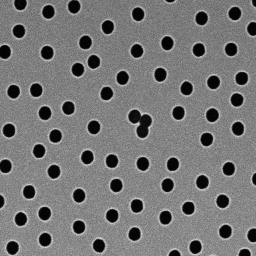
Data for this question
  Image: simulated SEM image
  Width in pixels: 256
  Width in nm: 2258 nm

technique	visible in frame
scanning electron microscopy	a regular array of holes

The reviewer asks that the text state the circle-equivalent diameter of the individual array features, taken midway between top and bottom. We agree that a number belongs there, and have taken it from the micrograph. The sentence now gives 0.115 micrometres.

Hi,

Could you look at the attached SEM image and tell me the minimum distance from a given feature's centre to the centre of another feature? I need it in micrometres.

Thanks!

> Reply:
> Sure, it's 0.234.